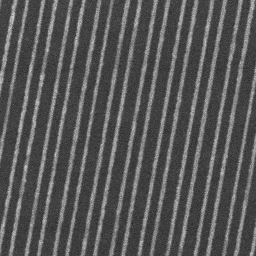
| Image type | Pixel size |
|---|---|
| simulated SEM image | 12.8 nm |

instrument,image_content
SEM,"parallel lines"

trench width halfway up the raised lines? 122 nm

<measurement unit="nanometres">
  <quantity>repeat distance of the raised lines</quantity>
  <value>178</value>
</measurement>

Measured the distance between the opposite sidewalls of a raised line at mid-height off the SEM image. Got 39.5 nm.